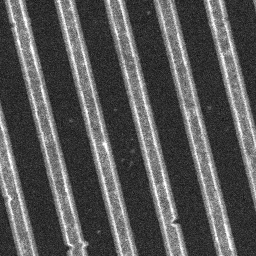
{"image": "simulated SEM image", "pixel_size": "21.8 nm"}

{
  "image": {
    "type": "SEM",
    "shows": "parallel lines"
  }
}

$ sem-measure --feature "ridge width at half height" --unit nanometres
325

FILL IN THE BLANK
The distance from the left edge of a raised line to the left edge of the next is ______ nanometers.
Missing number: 1050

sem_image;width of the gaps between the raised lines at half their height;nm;723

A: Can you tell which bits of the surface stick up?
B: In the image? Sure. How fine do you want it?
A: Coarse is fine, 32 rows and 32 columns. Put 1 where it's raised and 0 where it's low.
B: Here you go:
01100001100001100000110000110000
01100001100000110000110000110000
01110000110000110000110000110000
00110000110000110000110000011000
00110000110000110000011000011000
00110000110000011000011000011000
00110000011000011000011000011000
00011000011000011000011000001100
00011000011000011000001100001100
00011000011000001100001100001100
00011000001100001100001100001100
00001100001100001100001100000110
00001100001100001100000100000110
00001100001100000110000110000110
00001100000110000110000110000110
00000110000110000110000110000011
10000110000110000110000010000011
10000110000110000011000011000011
10000110000011000011000011000011
10000011000011000011000011000001
11000011000011000011000001000001
11000011000011000001100001100001
11000011000001100001100001100001
11000001100001100001100001100000
01100001100001100001100000110000
01100001100001100000110000110000
01100001100000110000110000110000
01100000110000110000110000110000
00110000110000110000110000011000
00110000110000110000011000011000
00110000111000011000011000011000
00110000011000011000011000011000